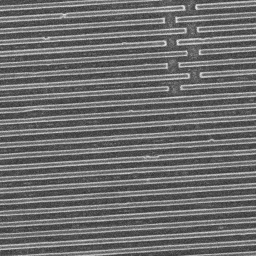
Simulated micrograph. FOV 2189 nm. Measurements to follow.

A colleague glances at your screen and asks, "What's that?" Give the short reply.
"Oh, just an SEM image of parallel lines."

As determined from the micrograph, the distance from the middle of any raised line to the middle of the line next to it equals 11.4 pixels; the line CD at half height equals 41.6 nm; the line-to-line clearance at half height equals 0.0576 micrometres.